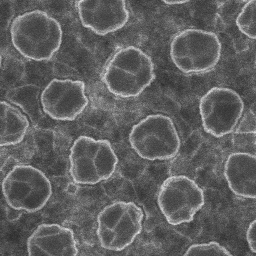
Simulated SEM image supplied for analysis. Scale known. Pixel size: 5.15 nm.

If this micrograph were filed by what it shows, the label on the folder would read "a regular array of raised bodies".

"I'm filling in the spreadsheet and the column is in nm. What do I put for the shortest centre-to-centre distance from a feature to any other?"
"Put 344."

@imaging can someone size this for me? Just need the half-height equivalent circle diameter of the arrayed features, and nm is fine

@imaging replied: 236